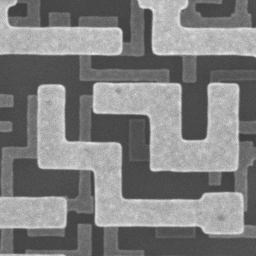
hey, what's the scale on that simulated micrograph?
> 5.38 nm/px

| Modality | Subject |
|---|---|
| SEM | wiring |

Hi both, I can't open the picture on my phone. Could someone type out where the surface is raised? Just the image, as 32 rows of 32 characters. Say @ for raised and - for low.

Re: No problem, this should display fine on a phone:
@@---------------@@@@@@---------
@------------------@@@@---------
@------------------@@@----------
@@@@@@@@@@@@@@@----@@@@@------@-
@@@@@@@@@@@@@@@----@@@@@@@@@@@@@
@@@@@@@@@@@@@@@----@@@@@@@@@@@@@
@@@@@@@@@@@@@@@----@@@@@@@@@@@@@
--------------------------------
--------------------------------
--------------------------------
------------@@-@@@@@------@@----
-----@@@----@@@@@@@@@@@---@@@@--
-----@@@----@@@@@@@@@@@---@@@@--
-----@@@----@@@@@@@@@@@---@@@@--
-----@@@----------@@@@@---@@@@--
-----@@@-----------@@@@---@@@@--
-----@@@-----------@@@@---@@@@--
-----@@@-----------@@@@--@@@@@--
-----@@@@@@@@@@----@@@@@@@@@@@--
-----@@@@@@@@@@----@@@@@@@@@@@--
-----@@@@@@@@@@----@@@@@@@@@@@--
------------@@@-----------------
------------@@@-----------------
------------@@@-----------------
------------@@@----------@@@@@--
@@@@@@@@----@@@@@@@@@@@@@@@@@@--
@@@@@@@@----@@@@@@@@@@@@@@@@@@--
@@@@@@@@----@@@@@@@@@@@@@@@@@@--
---@@--------------------@@@@@--
--------------------------------
--------------------------------
--------------------------------